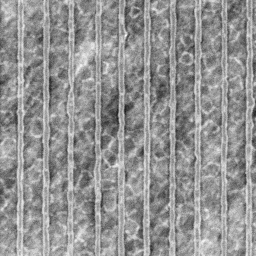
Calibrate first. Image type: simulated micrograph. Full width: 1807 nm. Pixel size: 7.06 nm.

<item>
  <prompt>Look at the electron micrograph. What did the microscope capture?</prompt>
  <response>parallel lines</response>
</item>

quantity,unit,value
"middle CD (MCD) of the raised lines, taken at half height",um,0.0326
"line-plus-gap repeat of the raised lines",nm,179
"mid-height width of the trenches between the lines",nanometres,147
